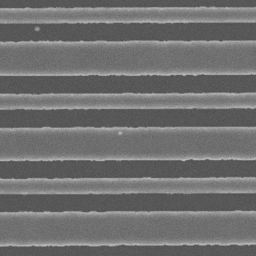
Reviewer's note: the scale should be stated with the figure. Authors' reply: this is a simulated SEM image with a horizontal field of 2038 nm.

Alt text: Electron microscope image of lines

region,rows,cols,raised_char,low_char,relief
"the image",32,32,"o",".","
................................
oooooooooooooooooooooooooooooooo
oooooooooooooooooooooooooooooooo
................................
................................
oooooooooooooooooooooooooooooooo
oooooooooooooooooooooooooooooooo
oooooooooooooooooooooooooooooooo
oooooooooooooooooooooooooooooooo
................................
................................
................................
oooooooooooooooooooooooooooooooo
oooooooooooooooooooooooo.o.oo..o
................................
................................
oooooooooooooooooooooooooooooooo
oooooooooooooooooooooooooooooooo
oooooooooooooooooooooooooooooooo
oooooooooooooooooooooooooooooooo
................................
................................
oooooooooooooooooooooooooooooooo
oooooooooooooooooooooooooooooooo
................................
................................
.....o..oo.o.ooooooooooooooooooo
oooooooooooooooooooooooooooooooo
oooooooooooooooooooooooooooooooo
oooooooooooooooooooooooooooooooo
oooooooooooooooooooooooooooooooo
................................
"